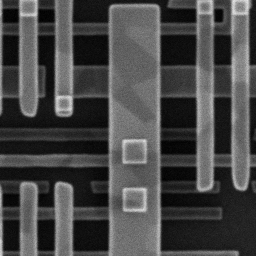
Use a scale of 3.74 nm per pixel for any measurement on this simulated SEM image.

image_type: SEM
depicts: wiring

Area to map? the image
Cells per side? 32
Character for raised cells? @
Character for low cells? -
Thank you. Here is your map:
---@@--@@----------------@@--@@-
---@@--@@-----@@@@@@-----@@--@@-
---@@--@@-----@@@@@@-----@@--@@-
---@@--@@-----@@@@@@-----@@--@@-
---@@--@@-----@@@@@@-----@@--@@-
---@@--@@-----@@@@@@-----@@--@@-
---@@--@@-----@@@@@@-----@@--@@-
---@@--@@-----@@@@@@-----@@--@@-
---@@--@@-----@@@@@@-----@@--@@-
---@@--@@-----@@@@@@-----@@--@@-
---@@--@@-----@@@@@@-----@@--@@-
---@@--@@-----@@@@@@-----@@--@@-
---@@--@@-----@@@@@@-----@@--@@-
---@@--@@-----@@@@@@-----@@--@@-
--------------@@@@@@-----@@--@@-
--------------@@@@@@-----@@--@@-
--------------@@@@@@-----@@--@@-
--------------@@@@@@-----@@--@@-
--------------@@@@@@-----@@--@@-
--------------@@@@@@-----@@--@@-
--------------@@@@@@-----@@--@@-
--------------@@@@@@-----@@--@@-
--------------@@@@@@-----@@--@@-
---@@--@@-----@@@@@@-----@----@-
---@@--@@-----@@@@@@------------
---@@--@@-----@@@@@@------------
---@@--@@-----@@@@@@------------
---@@--@@-----@@@@@@------------
---@@--@@-----@@@@@@------------
---@@--@@-----@@@@@@------------
---@@--@@-----@@@@@@------------
---@@--@@-----@@@@@@------------